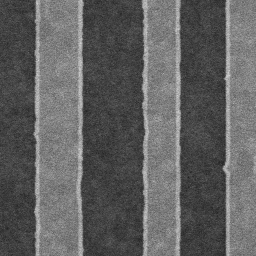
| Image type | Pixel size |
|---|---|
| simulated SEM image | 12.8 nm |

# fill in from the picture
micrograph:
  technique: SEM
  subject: one or a few lines or trenches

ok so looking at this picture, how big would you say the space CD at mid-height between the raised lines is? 737 nm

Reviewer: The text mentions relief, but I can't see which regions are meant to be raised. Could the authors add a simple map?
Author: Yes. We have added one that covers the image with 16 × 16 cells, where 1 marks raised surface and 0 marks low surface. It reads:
0011100001100011
0011100001100011
0011100001100011
0011100001100011
0011100001100011
0011100001100011
0011100001100011
0011100001100011
0011100001100011
0011100001100011
0011100001100011
0011100001100011
0011100001100011
0011100001100011
0011100001100011
0011100001100011